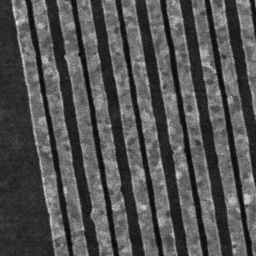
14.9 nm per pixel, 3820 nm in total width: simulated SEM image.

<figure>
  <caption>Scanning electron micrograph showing parallel lines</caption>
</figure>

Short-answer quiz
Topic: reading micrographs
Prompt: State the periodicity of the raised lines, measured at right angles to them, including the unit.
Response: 0.326 µm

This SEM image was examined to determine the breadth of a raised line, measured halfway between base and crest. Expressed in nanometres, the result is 184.